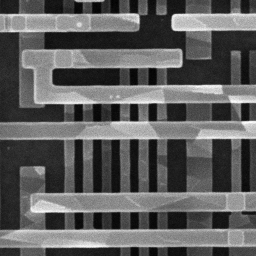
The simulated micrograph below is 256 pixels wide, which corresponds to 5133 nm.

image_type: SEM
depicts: wiring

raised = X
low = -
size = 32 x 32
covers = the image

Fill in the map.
--------------------------------
--------------------------------
XXXXXXXXXXXXXXXXX----XXXXXXXXXXX
XXXXXXXXXXXXXXXXX-----XXXXXXXXXX
--------------------------------
--------------------------------
---XXXXXXXXXXXXXXXXXXXX---------
---XXXXXXXXXXXXXXXXXXXX---------
----XXX-------------------------
----XX--------------------------
----XXX-------------------------
----XXXXXXXXXXXXXXXXXXXXXXXXXXXX
----XXXXXXXXXXXXXXXXXXXXXXXXXXXX
--------------------------------
--------------------------------
XXXXXXXXXXXXXXXXXXXXXXXXXXXXXXXX
XXXXXXXXXXXXXXXXXXXXXXXXXXXXXXXX
--------------------------------
--------------------------------
--------------------------------
--------------------------------
--------------------------------
--------------------------------
--------------------------------
----XXXXXXXXXXXXXXXXXXXXXXXXXXXX
----XXXXXXXXXXXXXXXXXXXXXXXXXXXX
----XX--------------------------
--------------------------------
--------------------------------
XXXXXXXXXXXXXXXXXXXXXXXXXXXXXXXX
XXXXXXXXXXXXXXXXXXXXXXXXXXXXXXXX
--------------------------------